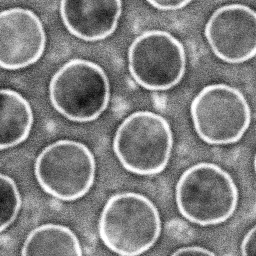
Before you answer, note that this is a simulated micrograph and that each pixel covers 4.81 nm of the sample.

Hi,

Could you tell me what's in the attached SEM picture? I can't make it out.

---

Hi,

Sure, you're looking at raised bodies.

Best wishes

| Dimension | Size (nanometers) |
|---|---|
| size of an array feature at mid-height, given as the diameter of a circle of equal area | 277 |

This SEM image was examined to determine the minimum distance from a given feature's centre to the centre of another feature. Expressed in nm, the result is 389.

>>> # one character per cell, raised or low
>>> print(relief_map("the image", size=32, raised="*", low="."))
........*******....****.........
.***....*******............*****
*****...*******...........******
*****....*****............******
*****.....***.....***.....******
*****............*****....******
*****...........*******....*****
****............*******.....**..
.*......****....*******.........
.......******....******.........
......*******.....****..........
*.....********...........****...
***....******............*****..
****...******...........*******.
****....****.....***....*******.
****...........******...*******.
***............******....*****..
***...........*******.....***...
......*****...*******...........
.....******....******...........
.....*******....*****...........
.....*******.....**....*****....
*....******............******...
**....*****...........*******...
**.....***.....**.....*******...
**............*****...*******...
**...........*******...******...
**...........*******....****....
.....***.....*******............
....*****....*******...........*
...*******...******...........**
...*******.....***....****....**